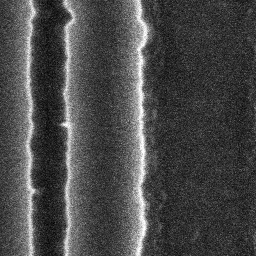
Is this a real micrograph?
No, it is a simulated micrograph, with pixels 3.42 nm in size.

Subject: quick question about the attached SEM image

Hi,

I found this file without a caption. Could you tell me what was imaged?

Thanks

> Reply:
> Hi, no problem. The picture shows one or a few lines or trenches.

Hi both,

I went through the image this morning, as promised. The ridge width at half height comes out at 259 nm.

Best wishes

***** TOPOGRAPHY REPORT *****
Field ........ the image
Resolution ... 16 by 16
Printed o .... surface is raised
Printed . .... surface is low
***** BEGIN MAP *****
oo..ooooo.......
oo..ooooo.......
oo..ooooo.......
oo..ooooo.......
oo..ooooo.......
oo..ooooo.......
oo..ooooo.......
oo..ooooo.......
oo..ooooo.......
oo..ooooo.......
oo..ooooo.......
oo..ooooo.......
oo..ooooo.......
oo..ooooo.......
oo..ooooo.......
oo..ooooo.......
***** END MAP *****